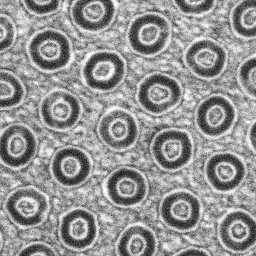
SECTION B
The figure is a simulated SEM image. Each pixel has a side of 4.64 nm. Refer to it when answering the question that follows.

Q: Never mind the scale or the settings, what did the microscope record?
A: a regular array of ring-shaped raised bodies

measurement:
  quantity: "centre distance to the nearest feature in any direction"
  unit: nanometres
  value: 268